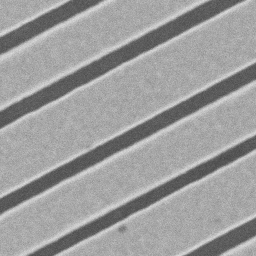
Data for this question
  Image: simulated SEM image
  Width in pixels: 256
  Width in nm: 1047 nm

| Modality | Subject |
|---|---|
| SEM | lines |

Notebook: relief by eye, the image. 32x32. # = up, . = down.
########....#############.....##
######....#############.....####
####....##############....######
##....##############....########
.....#############....##########
...#############....############
.#############....##############
############.....###############
##########....#################.
########.....################...
######.....################....#
####.....################....###
###....################....#####
#....################....#######
...################....#########
.#################....##########
################....############
##############....#############.
############....#############...
##########....#############....#
########....#############....###
######....#############....#####
####....#############....#######
##....#############....#########
#...#############....###########
..##############...#############
.#############...###############
############...################.
##########....###############...
########....###############.....
######....################....##
####....################....####